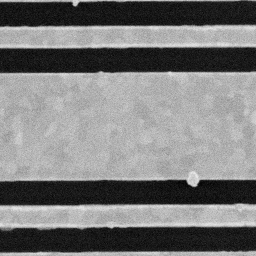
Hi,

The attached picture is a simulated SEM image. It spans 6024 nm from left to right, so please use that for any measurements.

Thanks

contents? lines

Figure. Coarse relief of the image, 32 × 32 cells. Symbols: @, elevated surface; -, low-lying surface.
--------------------------------
--------------------------------
--------------------------------
@@@@@@@@@@@@@@@@@@@@@@@@@@@@@@@@
@@@@@@@@@@@@@@@@@@@@@@@@@@@@@@@@
@@@@@@@@@@@@@@@@@@@@@@@@@@@@@@@@
--------------------------------
--------------------------------
--------------------------------
@@@@@@@@@@@@@@@@@@@@@@@@@@@@@@@@
@@@@@@@@@@@@@@@@@@@@@@@@@@@@@@@@
@@@@@@@@@@@@@@@@@@@@@@@@@@@@@@@@
@@@@@@@@@@@@@@@@@@@@@@@@@@@@@@@@
@@@@@@@@@@@@@@@@@@@@@@@@@@@@@@@@
@@@@@@@@@@@@@@@@@@@@@@@@@@@@@@@@
@@@@@@@@@@@@@@@@@@@@@@@@@@@@@@@@
@@@@@@@@@@@@@@@@@@@@@@@@@@@@@@@@
@@@@@@@@@@@@@@@@@@@@@@@@@@@@@@@@
@@@@@@@@@@@@@@@@@@@@@@@@@@@@@@@@
@@@@@@@@@@@@@@@@@@@@@@@@@@@@@@@@
@@@@@@@@@@@@@@@@@@@@@@@@@@@@@@@@
@@@@@@@@@@@@@@@@@@@@@@@@@@@@@@@@
@@@@@@@@@@@@@---@@@----@@-------
--------------------------------
--------------------------------
--------------------------------
@@@@@@@@@@@@@@@@@@@@@@@@@@@@@@@@
@@@@@@@@@@@@@@@@@@@@@@@@@@@@@@@@
--------------------------------
--------------------------------
--------------------------------
-------------------------------@